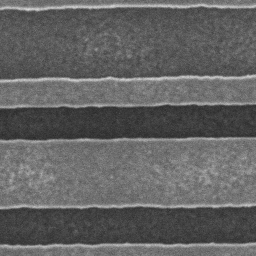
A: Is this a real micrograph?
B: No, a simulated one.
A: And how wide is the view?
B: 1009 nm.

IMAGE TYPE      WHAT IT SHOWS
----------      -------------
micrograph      lines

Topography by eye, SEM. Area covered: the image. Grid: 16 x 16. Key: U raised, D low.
UUUUDDDDDDDDDDDD
DDDDDDDDDDDDDDDD
DDDDDDDDDDDDDDDD
DDDDDDDDDDDDDDDD
DDDDDDDDDDDDDDDD
UUUUUUUUUUUUUUUU
UUUUUUUUUUUUUUUU
DDDDDDDDDDDDDDDD
DDDDDDDDDDDDDDDD
UUUUUUUUUUUUUUUU
UUUUUUUUUUUUUUUU
UUUUUUUUUUUUUUUU
UUUUUUUUUUUUUUUU
DDDDDDDDDDDDDDDD
DDDDDDDDDDDDDDDD
UUUUUUUUUUUUUUUU